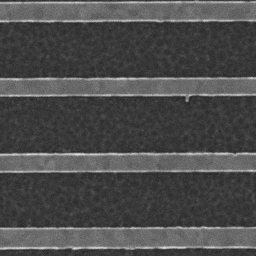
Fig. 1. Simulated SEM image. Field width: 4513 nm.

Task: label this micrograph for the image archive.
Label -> one or a few lines or trenches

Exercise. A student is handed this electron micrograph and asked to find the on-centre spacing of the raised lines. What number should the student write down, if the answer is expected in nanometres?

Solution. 1330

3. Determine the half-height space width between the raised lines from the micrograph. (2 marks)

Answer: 1010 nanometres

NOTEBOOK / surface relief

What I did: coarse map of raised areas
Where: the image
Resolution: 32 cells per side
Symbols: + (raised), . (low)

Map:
++++++++++++++++++++++++++++++++
++++++++++++++++++++++++++++++++
+++++++++++++.++...+++++++++++++
................................
................................
................................
................................
................................
................................
................................
++++++++++++++++++++++++++++++++
++++++++++++++++++++++++++++++++
................................
................................
................................
................................
................................
................................
................................
++++++++++++++++++++++++++++++++
++++++++++++++++++++++++++++++++
................................
................................
................................
................................
................................
................................
................................
......................+..+......
++++++++++++++++++++++++++++++++
++++++++++++++++++++++++++++++++
................................